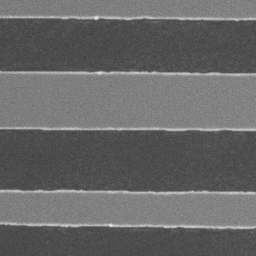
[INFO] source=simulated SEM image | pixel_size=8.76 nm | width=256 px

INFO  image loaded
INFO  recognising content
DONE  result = lines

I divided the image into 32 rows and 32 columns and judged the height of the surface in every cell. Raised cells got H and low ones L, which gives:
HHHHHHHHHHHHHHHHHHHHHHHHHHHHHHHH
HHHHHHHHHHHHHHHHHHHHHHHHHHHHHHHH
LLLLLLLLLLLLLLLLLLLLLLLLLLLLLHLL
LLLLLLLLLLLLLLLLLLLLLLLLLLLLLLLL
LLLLLLLLLLLLLLLLLLLLLLLLLLLLLLLL
LLLLLLLLLLLLLLLLLLLLLLLLLLLLLLLL
LLLLLLLLLLLLLLLLLLLLLLLLLLLLLLLL
LLLLLLLLLLLLLLLLLLLLLLLLLLLLLLLL
LLLLLLLLLLLLLLLLLLLLLLLLLLLLLLLL
HHHHHHHHHHHHHHHHHHHHHHHHHHHHHHHH
HHHHHHHHHHHHHHHHHHHHHHHHHHHHHHHH
HHHHHHHHHHHHHHHHHHHHHHHHHHHHHHHH
HHHHHHHHHHHHHHHHHHHHHHHHHHHHHHHH
HHHHHHHHHHHHHHHHHHHHHHHHHHHHHHHH
HHHHHHHHHHHHHHHHHHHHHHHHHHHHHHHH
HHHHHHHHHHHHHHHHHHHHHHHHHHHHHHHH
LLLLLLLLLLLLLLLLLLLLLLLLLLLLLLLL
LLLLLLLLLLLLLLLLLLLLLLLLLLLLLLLL
LLLLLLLLLLLLLLLLLLLLLLLLLLLLLLLL
LLLLLLLLLLLLLLLLLLLLLLLLLLLLLLLL
LLLLLLLLLLLLLLLLLLLLLLLLLLLLLLLL
LLLLLLLLLLLLLLLLLLLLLLLLLLLLLLLL
LLLLLLLLLLLLLLLLLLLLLLLLLLLLLLLL
LLLLLLLLLLLLLLLLLLLLLLLLLLLLLLLL
HHHHHHHHHHHHHHHHHHHHHHHHHHHHHHHH
HHHHHHHHHHHHHHHHHHHHHHHHHHHHHHHH
HHHHHHHHHHHHHHHHHHHHHHHHHHHHHHHH
HHHHHHHHHHHHHHHHHHHHHHHHHHHHHHHH
LLLLLLLLLLLLLLLLLLLLLLLLLLLHHHHH
LLLLLLLLLLLLLLLLLLLLLLLLLLLLLLLL
LLLLLLLLLLLLLLLLLLLLLLLLLLLLLLLL
LLLLLLLLLLLLLLLLLLLLLLLLLLLLLLLL